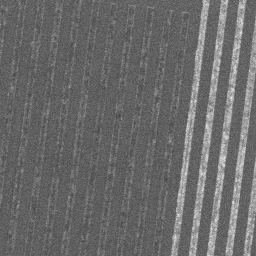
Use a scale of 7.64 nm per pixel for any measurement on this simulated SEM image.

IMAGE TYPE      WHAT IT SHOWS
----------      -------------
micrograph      parallel lines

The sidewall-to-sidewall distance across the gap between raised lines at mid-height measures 92.9 nm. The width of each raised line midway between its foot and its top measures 49.3 nm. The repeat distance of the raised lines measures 139 nm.